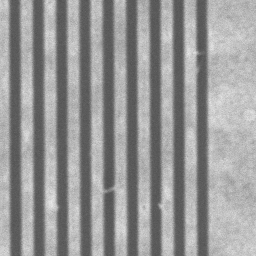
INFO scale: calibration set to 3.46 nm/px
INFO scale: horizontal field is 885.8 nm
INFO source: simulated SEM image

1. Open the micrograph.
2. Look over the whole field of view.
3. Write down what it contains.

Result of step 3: parallel lines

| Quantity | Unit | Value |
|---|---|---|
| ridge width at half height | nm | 47.2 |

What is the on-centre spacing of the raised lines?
81 nm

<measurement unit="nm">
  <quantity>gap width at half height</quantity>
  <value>33.8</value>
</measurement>